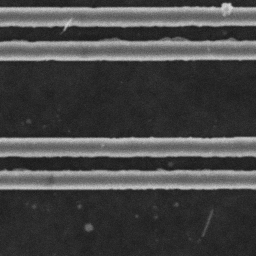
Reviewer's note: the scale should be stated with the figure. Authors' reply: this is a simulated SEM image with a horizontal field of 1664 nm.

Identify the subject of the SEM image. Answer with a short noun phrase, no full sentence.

lines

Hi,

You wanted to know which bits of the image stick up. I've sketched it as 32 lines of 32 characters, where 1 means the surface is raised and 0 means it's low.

00000000000000000000000000001000
11111111111111111111111111111111
11111111111111111111111111111111
00000000000000000000000000000000
00000000000000000000000000000000
11111111111111111111111111111111
11111111111111111111111111111111
11111101111100101110000000000000
00000000000000000000000000000000
00000000000000000000000000000000
00000000000000000000000000000000
00000000000000000000000000000000
00000000000000000000000000000000
00000000000000000000000000000000
00000000000000000000000000000000
00000000000000000000000000000000
00000000000000000000000000000000
11111111111111111111111111111111
11111111111111111111111111111111
10000000000100111000000000000000
00000000000000000000000000000000
11111111111111111111111111111111
11111111111111111111111111111111
11111111111111111111111111111111
00000000000000000000000000000000
00000000000000000000000000000000
00000000000000000000000000000000
00000000000000000000000000000000
00000000000000000000000000000000
00000000000000000000000000000000
00000000000000000000000000000000
00000000000000000000000000000000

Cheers